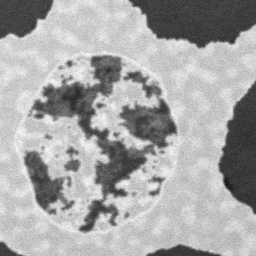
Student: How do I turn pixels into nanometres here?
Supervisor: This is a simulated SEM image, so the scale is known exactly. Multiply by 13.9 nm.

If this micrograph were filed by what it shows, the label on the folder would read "holes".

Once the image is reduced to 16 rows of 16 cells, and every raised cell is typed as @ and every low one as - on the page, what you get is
---@@@@@--------
--@@@@@@@-------
@@@@@@@@@@@----@
@@@@@---@@@@@@@@
@@@------@@@@@@@
@@@-------@@@@@@
@@---------@@@@-
@----------@@@--
@----------@@@--
@----------@@@--
@----------@@@--
@@--------@@@@--
@@--------@@@@@-
@@@------@@@@@@@
@@@@@-@@@@@@@@@@
-@@@@@@@@@--@@@@